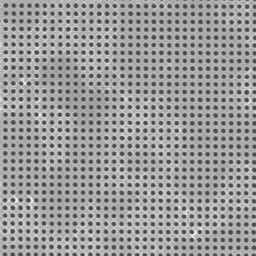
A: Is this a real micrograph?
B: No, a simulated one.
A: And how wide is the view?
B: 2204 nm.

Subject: a regular array of holes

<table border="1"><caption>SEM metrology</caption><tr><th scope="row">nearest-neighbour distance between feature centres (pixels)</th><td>7.39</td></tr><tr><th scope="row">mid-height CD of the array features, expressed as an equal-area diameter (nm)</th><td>41.2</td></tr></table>